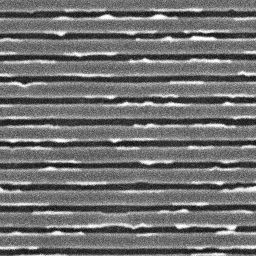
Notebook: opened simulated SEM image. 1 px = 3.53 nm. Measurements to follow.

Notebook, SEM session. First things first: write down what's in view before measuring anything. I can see parallel lines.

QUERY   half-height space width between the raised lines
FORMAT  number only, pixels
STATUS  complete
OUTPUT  6.74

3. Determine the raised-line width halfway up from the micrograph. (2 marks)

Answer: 0.0538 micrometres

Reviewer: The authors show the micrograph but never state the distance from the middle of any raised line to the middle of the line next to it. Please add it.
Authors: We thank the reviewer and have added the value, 76 nanometers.